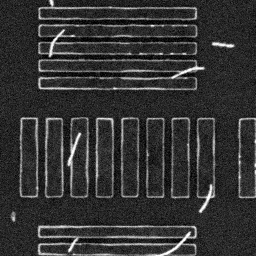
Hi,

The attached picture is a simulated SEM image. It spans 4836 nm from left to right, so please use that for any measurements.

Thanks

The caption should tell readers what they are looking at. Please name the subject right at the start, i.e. groups of lines, slits or small figures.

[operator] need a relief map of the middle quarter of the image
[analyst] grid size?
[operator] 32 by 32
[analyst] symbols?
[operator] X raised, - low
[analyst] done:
XXXXXXXXXXXXXXXXXXXXXXXXXXXXXXXX
XXXXXXXXXXXXXXXXXXXXXXXXXXXXXXXX
--------------------------------
---------------------------XX---
XXXXXXXXXXXXXXXXXXXXXXXXXXXXXXXX
XXXXXXXXXXXXXXXXXXXXXXXXXXXXXXXX
--------------------------------
--------------------------------
--------------------------------
--------------------------------
--------------------------------
--------------------------------
--------------------------------
--------------------------------
--XXXX--XXXX---XXXX--XXXX--XXXX-
--XXXX--XXXX---XXXX--XXXX--XXXX-
--XXXX--XXXX---XXXX--XXXX--XXXX-
--XXXX--XXXX---XXXX--XXXX--XXXX-
--XXXX--XXXX---XXXX--XXXX--XXXX-
--XXXX--XXXX---XXX---XXXX--XXXX-
--XXXX--XXXX---XXX---XXXX--XXXX-
--XXXX--XXXX---XXX---XXXX--XXXX-
--XXXX--XXXX---XXXX--XXXX--XXXX-
-XXXXX--XXXX---XXXX--XXXX--XXXX-
--XXXX--XXXX---XXX---XXXX--XXXX-
--XXXX--XXXX---XXX---XXXX--XXXX-
--XXX---XXXX---XXX---XXXX--XXXX-
--XXXX--XXXX---XXX---XXXX--XXXX-
--XXXX--XXXX---XXX---XXXX--XXXX-
--XXXX--XXXX---XXX---XXXX--XXXX-
--XXXX--XXXX---XXX---XXXX--XXXX-
--XXXX--XXXX---XXX---XXXX--XXXX-